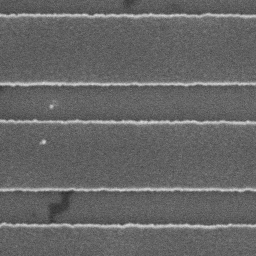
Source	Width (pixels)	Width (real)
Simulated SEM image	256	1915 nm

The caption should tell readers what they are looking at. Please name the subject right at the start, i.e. lines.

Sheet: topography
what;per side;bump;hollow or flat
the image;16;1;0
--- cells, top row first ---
0000000000000000
1111111111111111
1111111111111111
1111111111111111
1111111111111111
0000000000000000
0000000000000000
0000000000000000
1111111111111111
1111111111111111
1111111111111111
1111111111111111
0000000000000000
0000000000000000
1111111111111111
1111111111111111